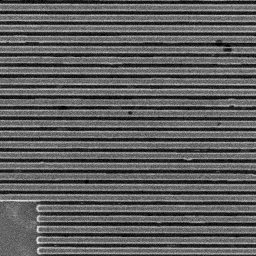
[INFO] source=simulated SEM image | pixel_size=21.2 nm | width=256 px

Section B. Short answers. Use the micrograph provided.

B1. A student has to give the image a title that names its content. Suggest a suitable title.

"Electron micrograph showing parallel lines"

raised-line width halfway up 135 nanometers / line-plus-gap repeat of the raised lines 224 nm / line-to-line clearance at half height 98.1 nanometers